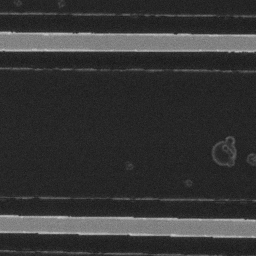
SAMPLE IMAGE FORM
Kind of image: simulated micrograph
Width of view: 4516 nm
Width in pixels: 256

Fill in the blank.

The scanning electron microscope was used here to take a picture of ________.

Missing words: lines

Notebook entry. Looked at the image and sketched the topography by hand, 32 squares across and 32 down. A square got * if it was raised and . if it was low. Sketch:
********************************
********************************
................................
................................
********************************
********************************
................................
................................
................................
********************************
********************************
********************************
********************************
********************************
********************************
********************************
********************************
********************************
********************************
********************************
********************************
********************************
********************************
********************************
********************************
................................
................................
******************************..
********************************
......................**********
................................
**..............................